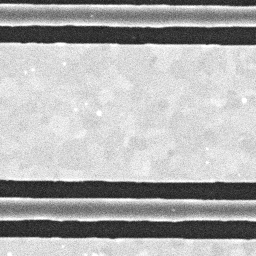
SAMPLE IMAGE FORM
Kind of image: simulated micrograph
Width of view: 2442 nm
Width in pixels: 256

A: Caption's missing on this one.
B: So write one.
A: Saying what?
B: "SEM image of lines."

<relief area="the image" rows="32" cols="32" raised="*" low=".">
................................
********************************
********************************
................................
................................
*********.......................
********************************
********************************
********************************
********************************
********************************
********************************
********************************
********************************
********************************
********************************
********************************
********************************
********************************
********************************
********************************
********************************
......*****..*******************
................................
................................
********************************
********************************
.......*.****...*.*****....**..*
................................
................................
********************************
********************************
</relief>